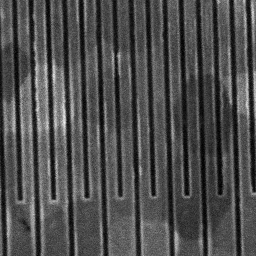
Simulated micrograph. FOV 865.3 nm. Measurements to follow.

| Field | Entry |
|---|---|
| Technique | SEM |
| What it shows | parallel lines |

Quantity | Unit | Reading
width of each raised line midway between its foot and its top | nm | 38.4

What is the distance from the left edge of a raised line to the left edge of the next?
56.4 nm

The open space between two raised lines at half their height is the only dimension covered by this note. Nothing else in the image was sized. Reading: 19.4 nanometres